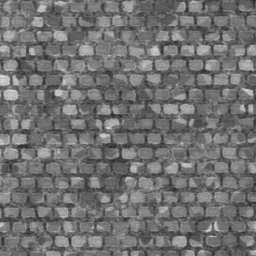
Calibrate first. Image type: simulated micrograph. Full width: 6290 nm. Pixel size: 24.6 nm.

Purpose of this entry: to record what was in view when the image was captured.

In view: a regular array of raised bodies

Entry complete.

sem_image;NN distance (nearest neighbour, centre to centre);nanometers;403